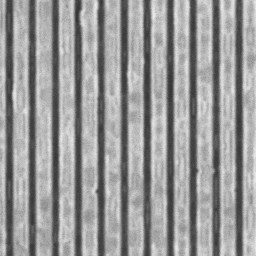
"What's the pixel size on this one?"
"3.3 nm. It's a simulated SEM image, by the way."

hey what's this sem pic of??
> parallel lines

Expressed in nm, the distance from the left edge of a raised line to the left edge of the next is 75.8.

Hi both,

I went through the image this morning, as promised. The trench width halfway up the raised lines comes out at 0.026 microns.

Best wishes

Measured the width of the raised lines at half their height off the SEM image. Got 48.7 nanometers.